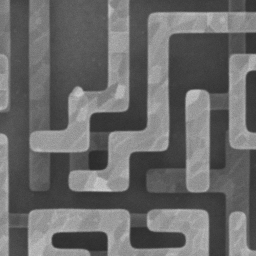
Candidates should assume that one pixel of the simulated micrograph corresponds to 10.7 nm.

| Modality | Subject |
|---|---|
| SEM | wiring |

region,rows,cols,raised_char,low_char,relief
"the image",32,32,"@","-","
--------------@@----------------
--------------@@----------------
--------------@@---@@@@@@@@@@@@@
--------------@@---@@@@@@@@@@@@@
--------------@@---@@-----------
--------------@@---@@-----------
--------------@@---@@-----------
@-------------@@---@@--------@@@
@-------------@@---@@--------@@@
@-------------@@---@@--------@@-
@-------------@@---@@--------@@-
@--------@@-@@@@---@@---@@---@@-
@--------@@@@@@@--@@@--@@@---@@-
@--------@@@@@@@--@@@--@@@---@@-
---------@@-------@@@--@@@---@@-
---------@@-------@@@--@@@---@@-
----@@@@@@@---@@@@@@@--@@@---@@-
@---@@@@@@@---@@@@@@@--@@@---@@@
@---@@@@@@@---@@@@@@@--@@@---@@@
@-------------@@-------@@@------
@------------@@@-------@@@------
@--------@@@@@@@-------@@@------
@--------@@@@@@@-------@@@------
@--------@@@@@@@-------@@@------
@-------------------------------
@-------------------------------
@---@@@@@@@@@@@@---@@@@@@@---@--
@---@@@@@@@@@@@@--@@@@@@@@---@@-
@---@@@@@@@@@@@@---@@@@@@@---@@-
@---@@@------@@@-------@@@---@@-
@---@@@-------@@-------@@@---@@-
@---@@@@@@@---@@@@@@@@@@@@---@@@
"